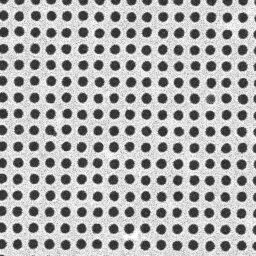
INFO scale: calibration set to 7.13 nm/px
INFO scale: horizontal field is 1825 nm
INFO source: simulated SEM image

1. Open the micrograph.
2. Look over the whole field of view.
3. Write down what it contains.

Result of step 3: a regular array of holes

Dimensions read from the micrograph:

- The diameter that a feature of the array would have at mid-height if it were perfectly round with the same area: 0.0737 microns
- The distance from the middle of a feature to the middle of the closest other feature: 15.6 px